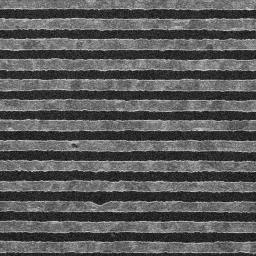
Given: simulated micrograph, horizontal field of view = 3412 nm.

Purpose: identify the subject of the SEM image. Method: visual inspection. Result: parallel lines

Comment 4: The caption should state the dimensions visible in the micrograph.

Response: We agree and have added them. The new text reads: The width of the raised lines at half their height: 132 nanometres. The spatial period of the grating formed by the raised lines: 270 nm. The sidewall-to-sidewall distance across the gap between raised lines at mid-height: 138 nm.